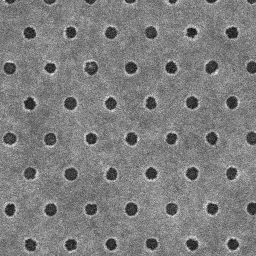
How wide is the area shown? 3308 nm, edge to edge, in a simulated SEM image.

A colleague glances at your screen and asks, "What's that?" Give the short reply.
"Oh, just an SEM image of a regular array of holes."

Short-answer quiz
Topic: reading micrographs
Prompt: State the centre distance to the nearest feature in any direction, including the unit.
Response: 0.516 micrometres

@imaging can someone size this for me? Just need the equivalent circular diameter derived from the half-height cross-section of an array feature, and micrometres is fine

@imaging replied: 0.164